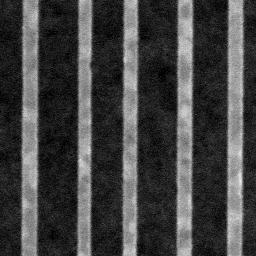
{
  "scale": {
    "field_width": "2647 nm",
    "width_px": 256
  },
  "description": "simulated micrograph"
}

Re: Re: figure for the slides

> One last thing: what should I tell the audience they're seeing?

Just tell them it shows parallel lines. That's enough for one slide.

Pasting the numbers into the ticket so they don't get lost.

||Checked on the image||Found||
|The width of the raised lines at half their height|0.135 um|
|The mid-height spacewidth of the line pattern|409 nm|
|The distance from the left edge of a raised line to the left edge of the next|531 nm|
